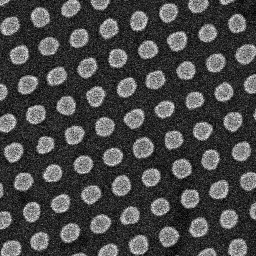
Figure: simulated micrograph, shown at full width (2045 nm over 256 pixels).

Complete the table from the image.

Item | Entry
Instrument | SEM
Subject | a regular array of raised bodies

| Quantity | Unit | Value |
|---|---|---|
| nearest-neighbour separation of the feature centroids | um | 0.243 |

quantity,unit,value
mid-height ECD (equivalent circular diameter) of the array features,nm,140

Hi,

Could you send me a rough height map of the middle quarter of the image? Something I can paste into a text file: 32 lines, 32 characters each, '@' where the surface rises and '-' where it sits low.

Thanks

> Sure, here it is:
----@@@@----@@---------------@@@
----@@@@--------------------@@@@
----@@@---------------@@@---@@@@
---------------------@@@@-----@@
--------------@@@@---@@@@-------
--------------@@@@---@@@--------
-------@@@----@@@@--------------
------@@@@----@@@---------------
@@----@@@@---------------------@
@@----@@@----------------@-----@
@@@--------------------@@@@----@
@@@---------------@----@@@@-----
@@--------------@@@@---@@@@-----
---------------@@@@@------------
---------@@@---@@@@@------------
--------@@@@----@@--------------
-@@@@---@@@@--------------------
@@@@@----@@---------------@@@---
-@@@---------------------@@@@@--
-@@@--------------@@@@---@@@@---
------------------@@@@----@@----
-----------@@@---@@@@@----------
----------@@@@----@@@-----------
----@@----@@@@------------------
---@@@@---@@@@--------------@@@-
---@@@@--------------------@@@@@
---@@@---------------@@----@@@@@
--------------------@@@@----@@@-
-------------@@@----@@@@--------
-------------@@@----@@@---------
------------@@@@----------------
-----@@@@---@@@@----------------